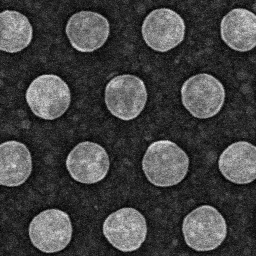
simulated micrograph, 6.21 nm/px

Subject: a regular array of raised bodies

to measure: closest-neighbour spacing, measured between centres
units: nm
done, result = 470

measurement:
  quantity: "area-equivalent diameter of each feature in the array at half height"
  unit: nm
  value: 264